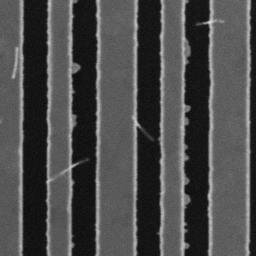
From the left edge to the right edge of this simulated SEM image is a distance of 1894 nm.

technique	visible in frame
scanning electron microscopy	lines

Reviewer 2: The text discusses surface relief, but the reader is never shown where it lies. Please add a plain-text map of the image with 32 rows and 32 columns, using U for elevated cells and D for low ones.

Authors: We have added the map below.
UUUDDDUUUDDDUUUUUDDDUUUDDDUUUUUD
UUUDDDUUUDDDUUUUUDDDUUUDDDUUUUUD
UUUDDDUUUDDDUUUUUDDDUUUDDDUUUUUD
UUUDDDUUUDDDUUUUUDDDUUUDDDUUUUUD
UUUDDDUUUDDDUUUUUDDDUUUDDDUUUUUD
UUUDDDUUUDDDUUUUUDDDUUUDDDUUUUUD
UUUDDDUUUDDDUUUUUDDDUUUUDDUUUUUD
UUUDDDUUUDDDUUUUUDDDUUUDDDUUUUUD
UUUDDDUUUUDDUUUUUDDDUUUDDDUUUUUD
UUUDDDUUUDDDUUUUUDDDUUUDDDUUUUUD
UUUDDDUUUDDDUUUUUDDDUUUDDDUUUUUD
UUUDDDUUUDDDUUUUUDDDUUUDDDUUUUUD
UUUDDDUUUDDDUUUUUDDDUUUDDDUUUUUD
UUUDDDUUUDDDUUUUUDDDUUUDDDUUUUUD
UUUDDDUUUDDDUUUUUDDDUUUDDDUUUUUD
UUUDDDUUUDDDUUUUUDDDUUUDDDUUUUUD
UUUDDDUUUDDDUUUUUDDDUUUDDDUUUUUD
UUUDDDUUUDDDUUUUUDDDUUUDDDUUUUUD
UUUDDDUUUDDDUUUUUDDDUUUDDDUUUUUD
UUUDDDUUUDDDUUUUUDDDUUUDDDUUUUUD
UUUDDDUUUDDDUUUUUDDDUUUDDDUUUUUD
UUUDDDUUUDDDUUUUUDDDUUUDDDUUUUUD
UUUDDDUUUDDDUUUUUDDDUUUDDDUUUUUD
UUUDDDUUUDDDUUUUUDDDUUUDDDUUUUUD
UUUDDDUUUDDDUUUUUDDDUUUDDDUUUUUD
UUUDDDUUUDDDUUUUUDDDUUUDDDUUUUUD
UUUDDDUUUDDDUUUUUDDDUUUDDDUUUUUD
UUUDDDUUUDDDUUUUUDDDUUUDDDUUUUUD
UUUDDDUUUDDDUUUUUDDDUUUDDDUUUUUD
UUUDDDUUUDDDUUUUUDDDUUUDDDUUUUUD
UUUDDDUUUDDDUUUUUDDDUUUDDDUUUUUD
UUUDDDUUUDDDUUUUUDDDUUUDDDUUUUUD